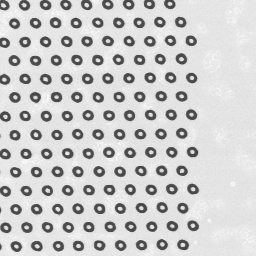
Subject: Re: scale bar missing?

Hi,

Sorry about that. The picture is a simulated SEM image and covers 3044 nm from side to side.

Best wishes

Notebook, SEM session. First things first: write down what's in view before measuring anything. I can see a regular array of ring-shaped grooves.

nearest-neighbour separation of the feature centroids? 245 nm